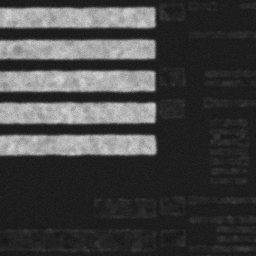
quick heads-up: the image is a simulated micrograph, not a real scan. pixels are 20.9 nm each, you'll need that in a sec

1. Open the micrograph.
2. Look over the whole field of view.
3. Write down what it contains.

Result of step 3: wiring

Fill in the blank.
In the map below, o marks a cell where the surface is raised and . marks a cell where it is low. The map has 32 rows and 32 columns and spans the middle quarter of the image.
................................
........................oooooo..
ooooooooooooooooooooooo.oooooo..
ooooooooooooooooooooooo.oooooo..
ooooooooooooooooooooooo.oooooo..
ooooooooooooooooooooooo.........
oooooooooooooooooooooo..........
................................
................................
........................oooooo..
ooooooooooooooooooooooo.oooooo..
ooooooooooooooooooooooo.oooooo..
ooooooooooooooooooooooo.oooooo..
ooooooooooooooooooooooo.........
oooooooooooooooooooo.o..........
................................
................................
................................
ooooooooooooooooooooooo.........
ooooooooooooooooooooooo.........
ooooooooooooooooooooooo.........
ooooooooooooooooooooooo.........
oooo............o...............
................................
................................
................................
................................
................................
................................
................................
................................
................................